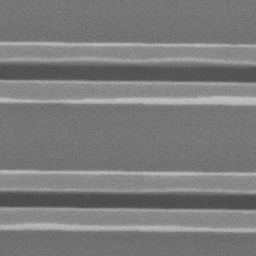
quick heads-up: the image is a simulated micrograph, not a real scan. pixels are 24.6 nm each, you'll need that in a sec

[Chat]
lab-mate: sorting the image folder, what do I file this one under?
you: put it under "lines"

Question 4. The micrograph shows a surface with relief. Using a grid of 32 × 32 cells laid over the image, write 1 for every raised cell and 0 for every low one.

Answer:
00000000000000000000000000000000
00000000000000000000000000000000
00000000000000000000000000000000
00000000000000000000000000000000
00000000000000000000000000000000
11111111111111111000000000000000
11111111111111111111111111111111
11111111111111111111111111111111
00000000000000000000000000000000
00000000000000000000000000000000
11111111111111111111111111111111
11111111111111111111111111111111
11111111111111111111111111111111
00000000000000000000000000000000
00000000000000000000000000000000
00000000000000000000000000000000
00000000000000000000000000000000
00000000000000000000000000000000
00000000000000000000000000000000
00000000000000000000000000000000
00000000000000000000000000000000
11111111111111000000000000000000
11111111111111111111111111111111
11111111111111111111111111111111
00000000000000000000000000000000
00000000000000000000000000000000
11111111111111111111111111111111
11111111111111111111111111111111
00000000000011111111111111111111
00000000000000000000000000000000
00000000000000000000000000000000
00000000000000000000000000000000